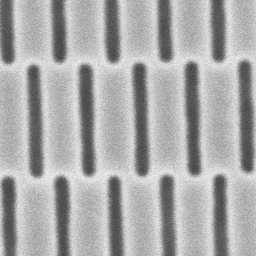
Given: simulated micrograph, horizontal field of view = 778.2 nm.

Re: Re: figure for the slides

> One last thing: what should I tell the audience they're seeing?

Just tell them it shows holes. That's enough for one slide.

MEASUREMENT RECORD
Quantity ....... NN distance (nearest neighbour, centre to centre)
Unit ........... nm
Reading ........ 158